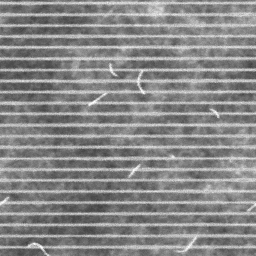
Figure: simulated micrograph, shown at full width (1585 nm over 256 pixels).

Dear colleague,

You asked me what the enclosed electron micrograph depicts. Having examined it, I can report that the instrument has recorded parallel lines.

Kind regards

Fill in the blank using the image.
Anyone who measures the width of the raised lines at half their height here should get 10.8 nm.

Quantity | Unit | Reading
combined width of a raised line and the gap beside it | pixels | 11.1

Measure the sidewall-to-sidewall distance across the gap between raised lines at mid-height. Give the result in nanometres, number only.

58